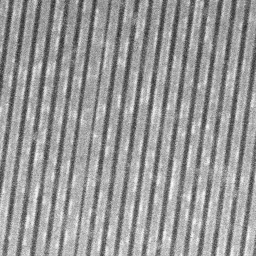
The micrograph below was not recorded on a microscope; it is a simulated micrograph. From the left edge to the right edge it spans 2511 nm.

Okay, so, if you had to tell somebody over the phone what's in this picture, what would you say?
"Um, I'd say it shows parallel lines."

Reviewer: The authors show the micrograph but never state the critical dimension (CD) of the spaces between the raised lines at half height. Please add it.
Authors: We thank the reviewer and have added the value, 64.4 nm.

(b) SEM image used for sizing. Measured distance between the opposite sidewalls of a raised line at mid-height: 0.0716 microns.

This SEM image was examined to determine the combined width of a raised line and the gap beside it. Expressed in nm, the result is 135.